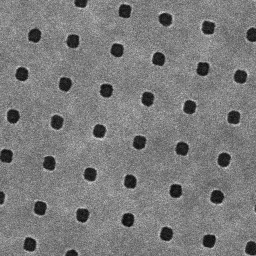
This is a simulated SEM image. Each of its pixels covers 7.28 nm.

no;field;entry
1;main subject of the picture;a regular array of holes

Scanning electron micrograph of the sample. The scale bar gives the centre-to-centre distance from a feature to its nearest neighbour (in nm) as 293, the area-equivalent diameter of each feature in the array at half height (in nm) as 105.